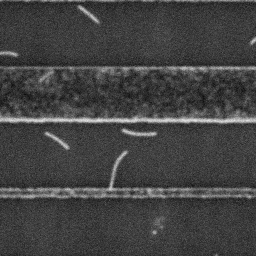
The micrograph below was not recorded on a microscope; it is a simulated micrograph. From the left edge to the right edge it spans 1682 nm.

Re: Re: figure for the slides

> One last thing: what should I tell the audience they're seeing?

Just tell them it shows lines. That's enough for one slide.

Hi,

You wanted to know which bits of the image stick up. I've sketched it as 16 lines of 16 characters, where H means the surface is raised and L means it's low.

LLLLLLLLLLLLLLLL
LLLLLLLLLLLLLLLL
LLLLLLLLLLLLLLLL
LLLLLLLLLLLLLLLL
HHHHHHHHHHHHHHHH
HHHHHHHHHHHHHHHH
HHHHHHHHHHHHHHHH
LLHLLHHHHHLHHHHH
LLLLLLLLLLLLLLLL
LLLLLLLLLLLLLLLL
LLLLLLLLLLLLLLLL
LLLLLLLLLLLLLLLL
LLLLLLLLLLLLLLLL
LLLLLLLLLLLLLLLL
LLLLLLLLLLLLLLLL
LLLLLLLLLLLLLLLL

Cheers